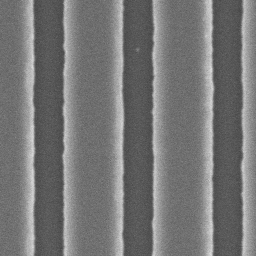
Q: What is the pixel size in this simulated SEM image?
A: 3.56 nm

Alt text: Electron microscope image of lines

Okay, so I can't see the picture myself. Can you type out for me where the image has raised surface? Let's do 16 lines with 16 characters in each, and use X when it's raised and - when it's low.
XX--XXXX--XXX--X
XX--XXXX--XXX--X
XX--XXXX--XXX--X
XX--XXXX--XXX--X
XX--XXXX--XXX--X
XX--XXXX--XXX--X
XX--XXXX--XXX--X
XX--XXXX--XXX--X
XX--XXXX--XXX--X
XX--XXXX--XXX--X
XX--XXXX--XXX--X
XX--XXXX--XXX--X
XX--XXXX--XXX--X
XX--XXXX--XXX--X
XX--XXXX--XXX--X
XX--XXXX--XXX--X